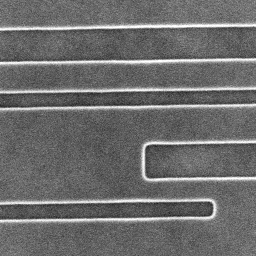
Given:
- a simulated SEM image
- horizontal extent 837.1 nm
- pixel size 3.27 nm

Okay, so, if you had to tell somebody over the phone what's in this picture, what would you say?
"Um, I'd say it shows groups of lines, slits or small figures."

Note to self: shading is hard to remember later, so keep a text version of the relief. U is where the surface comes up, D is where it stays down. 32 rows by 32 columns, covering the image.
UUUUUUUUUUUUUUUUUUUUUUUUUUUUUUUU
UUUUUUUUUUUUUUUUUUUUUUUUUUUUUUUU
UUUUUUUUUUUUUUUUUUUUUUUUUUUUUUUU
UUUUUUUUUUDDDDDDDDDDDDDDDDDDDDDD
DDDDDDDDDDDDDDDDDDDDDDDDDDDDDDDD
DDDDDDDDDDDDDDDDDDDDDDDDDDDDDDDD
DDDDDDDDDDDDDDDDDDDDDDDDDDDDDDDD
DDDDDDDDDDDDDDDDDDDDDDDDUUUUUUUU
UUUUUUUUUUUUUUUUUUUUUUUUUUUUUUUU
UUUUUUUUUUUUUUUUUUUUUUUUUUUUUUUU
UUUUUUUUUUUUUUUUUUUUUUUUUUUUUUUU
UUUUDDDDDDDDDDDDDDDDDDDDDDDDDDDD
DDDDDDDDDDDDDDDDDDDDDDDDDDDDDDDD
DDDDDDDDUUUUUUUUUUUUUUUUUUUUUUUU
UUUUUUUUUUUUUUUUUUUUUUUUUUUUUUUU
UUUUUUUUUUUUUUUUUUUUUUUUUUUUUUUU
UUUUUUUUUUUUUUUUUUUUUUUUUUUUUUUU
UUUUUUUUUUUUUUUUUUUUUUUUUUUUUUUU
UUUUUUUUUUUUUUUUUUDDDDDDDDDDDDDD
UUUUUUUUUUUUUUUUUUDDDDDDDDDDDDDD
UUUUUUUUUUUUUUUUUUDDDDDDDDDDDDDD
UUUUUUUUUUUUUUUUUUDDDDDDDDDDDDDD
UUUUUUUUUUUUUUUUUUUUUUUUUUUUUUUU
UUUUUUUUUUUUUUUUUUUUUUUUUUUUUUUU
UUUUUUUUUUUUUUUUUUUUUUUUUUUUUUUU
UUDDDDDDDDDDDDDDDDDDDDDDDDDUUUUU
DDDDDDDDDDDDDDDDDDDDDDDDDDDUUUUU
DDDDUUDDDUUUUUUUUUUUUUUUUUUUUUUU
UUUUUUUUUUUUUUUUUUUUUUUUUUUUUUUU
UUUUUUUUUUUUUUUUUUUUUUUUUUUUUUUU
UUUUUUUUUUUUUUUUUUUUUUUUUUUUUUUU
UUUUUUUUUUUUUUUUUUUUUUUUUUUUUUUU